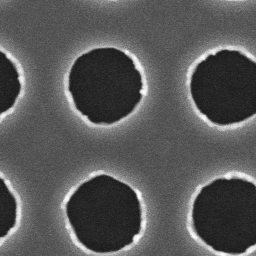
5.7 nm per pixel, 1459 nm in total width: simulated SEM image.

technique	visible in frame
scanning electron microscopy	holes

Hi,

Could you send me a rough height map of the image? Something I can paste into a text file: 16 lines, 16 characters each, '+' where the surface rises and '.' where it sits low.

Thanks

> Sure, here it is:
++++++++++++++++
++++++++++++++++
++++++++++++++++
+++++...+++++..+
.+++.....+++....
.+++.....+++....
.++++....+++....
++++++.++++++..+
++++++++++++++++
++++++++++++++++
++++++++++++++++
+++++...+++++...
.+++.....+++....
.+++.....+++....
+++++....+++....
++++++..+++++...